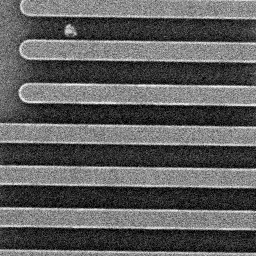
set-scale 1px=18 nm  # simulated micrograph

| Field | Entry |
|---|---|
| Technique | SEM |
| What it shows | groups of lines, slits or small figures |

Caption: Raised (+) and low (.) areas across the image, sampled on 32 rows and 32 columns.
...+++++++++++++++++++++++++++++
...+++++++++++++++++++++++++++++
................................
................................
................................
...+++++++++++++++++++++++++++++
...+++++++++++++++++++++++++++++
.............+++++++++++++++++++
................................
................................
................................
..++++++++++++++++++++++++++++++
...+++++++++++++++++++++++++++++
................................
................................
................................
++++++++++++++++++++++++++++++++
++++++++++++++++++++++++++++++++
................................
................................
................................
++++++++++++++++++++++++++++++++
++++++++++++++++++++++++++++++++
................................
................................
................................
++++++++++++++++++++++++++++++++
++++++++++++++++++++++++++++++++
.................+++++++++++++++
................................
................................
++++++++++++++..................